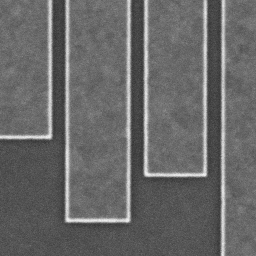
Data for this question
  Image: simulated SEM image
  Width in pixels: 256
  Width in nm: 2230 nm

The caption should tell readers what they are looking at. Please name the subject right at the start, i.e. one or a few lines or trenches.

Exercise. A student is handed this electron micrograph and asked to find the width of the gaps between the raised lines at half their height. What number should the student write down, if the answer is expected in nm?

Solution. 143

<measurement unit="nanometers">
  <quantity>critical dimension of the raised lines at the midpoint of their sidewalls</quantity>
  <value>542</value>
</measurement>